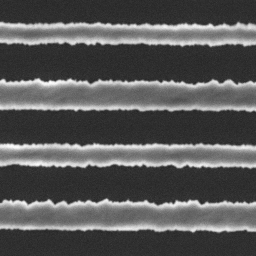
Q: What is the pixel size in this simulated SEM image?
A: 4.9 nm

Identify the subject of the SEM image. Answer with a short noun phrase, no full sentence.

lines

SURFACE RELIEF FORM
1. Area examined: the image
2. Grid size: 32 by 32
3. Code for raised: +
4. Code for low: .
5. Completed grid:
................................
................................
................................
++++++++++++++++++++++++++++++++
++++++++++++++++++++++++++++++++
...................+.+++.+++..++
................................
................................
................................
................................
++++++++++++++++++++++++.+++++++
++++++++++++++++++++++++++++++++
++++++++++++++++++++++++++++++++
++++++++++++++++++++++++++++++++
................................
................................
................................
................................
++++++++++++++++++++++++++++++++
++++++++++++++++++++++++++++++++
+..+++++++++++++++++++++++++++++
................................
................................
................................
................................
+++++++++++++++++++.++++++++++++
++++++++++++++++++++++++++++++++
++++++++++++++++++++++++++++++++
++++++++++++++++++++++++++++++++
................................
................................
................................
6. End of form